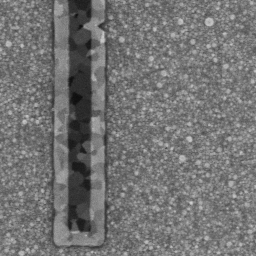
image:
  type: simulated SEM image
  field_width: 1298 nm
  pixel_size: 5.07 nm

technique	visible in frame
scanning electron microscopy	one or a few lines or trenches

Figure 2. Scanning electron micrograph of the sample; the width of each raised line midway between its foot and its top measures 0.196 µm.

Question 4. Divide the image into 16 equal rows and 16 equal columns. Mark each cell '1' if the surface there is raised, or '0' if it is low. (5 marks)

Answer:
0000110000000000
0000110000000000
0000110000000000
0000110000000000
0000110000000000
0000110000000000
0000110000000000
0000110000000000
0000110000000000
0000110000000000
0000110000000000
0000110000000000
0000110000000000
0000110000000000
0000110000000000
0000000000000000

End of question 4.